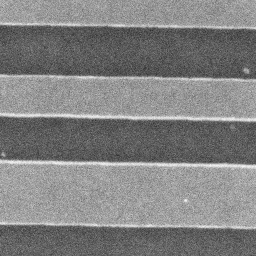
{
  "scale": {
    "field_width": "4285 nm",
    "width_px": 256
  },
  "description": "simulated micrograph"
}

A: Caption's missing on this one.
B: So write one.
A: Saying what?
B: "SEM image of lines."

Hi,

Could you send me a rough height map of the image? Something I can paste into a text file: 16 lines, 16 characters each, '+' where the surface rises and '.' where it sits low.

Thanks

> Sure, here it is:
++++++++++++++++
++++++++++++++++
................
................
................
++++++++++++++++
++++++++++++++++
................
................
................
++++++++++++++++
++++++++++++++++
++++++++++++++++
++++++++++++++++
................
................